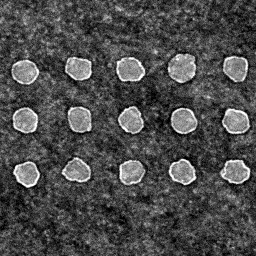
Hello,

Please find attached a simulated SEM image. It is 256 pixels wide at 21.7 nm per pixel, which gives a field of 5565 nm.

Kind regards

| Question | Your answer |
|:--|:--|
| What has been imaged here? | a regular array of raised bodies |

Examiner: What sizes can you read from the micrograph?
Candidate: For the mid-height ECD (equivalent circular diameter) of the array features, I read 0.528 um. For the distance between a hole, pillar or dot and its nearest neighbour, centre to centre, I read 1090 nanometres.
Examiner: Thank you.